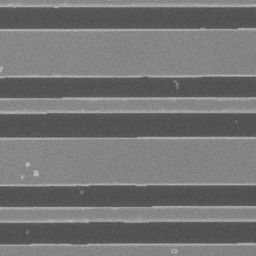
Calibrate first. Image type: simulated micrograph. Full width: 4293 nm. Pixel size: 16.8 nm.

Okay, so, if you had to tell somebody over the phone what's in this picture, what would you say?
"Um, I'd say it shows lines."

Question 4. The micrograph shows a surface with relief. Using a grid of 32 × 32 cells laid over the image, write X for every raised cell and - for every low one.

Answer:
XXXXXXXXXXXXXXXXXXXXXXXXXXXXXXXX
--------------------------------
--------------------------------
--------------------------------
XXXXXXXXXXXXXXXXXXXXXXXXXXXXXXXX
XXXXXXXXXXXXXXXXXXXXXXXXXXXXXXXX
XXXXXXXXXXXXXXXXXXXXXXXXXXXXXXXX
XXXXXXXXXXXXXXXXXXXXXXXXXXXXXXXX
XXXXXXXXXXXXXXXXXXXXXXXXXXXXXXXX
XXXXXXXXXXXXXXXXXX--XXX---------
--------------------------------
--------------------------------
XXXXXXXXXXXXXXXXXXXXXXXXXXXXXXXX
XXXXXXXXXXXXXXXXXXXXXXXXXXXXXXXX
--------------------------------
--------------------------------
--------------------------------
XXXXXXXXXXXXXXXXXXXXXXXXXXXXXXXX
XXXXXXXXXXXXXXXXXXXXXXXXXXXXXXXX
XXXXXXXXXXXXXXXXXXXXXXXXXXXXXXXX
XXXXXXXXXXXXXXXXXXXXXXXXXXXXXXXX
XXXXXXXXXXXXXXXXXXXXXXXXXXXXXXXX
XXXXXXXXXXXXXXXXXXXXXXXXXXXXXXXX
--------------------------------
--------------------------------
--------------------------------
XXXXXXXXXXXXXXXXXXXXXXXXXXXXXXXX
XXXXXXXXXXXXXXXXXXXXXXXXXXXXXXXX
--------------------------------
--------------------------------
--------------------------------
XXXXXXXXXXXXXXXXXXXXXXXXXXXXXXXX